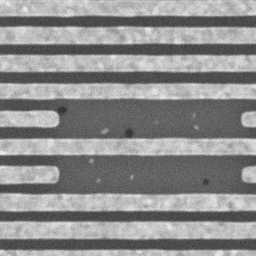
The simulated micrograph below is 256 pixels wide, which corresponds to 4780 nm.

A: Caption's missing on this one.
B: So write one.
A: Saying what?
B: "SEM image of wiring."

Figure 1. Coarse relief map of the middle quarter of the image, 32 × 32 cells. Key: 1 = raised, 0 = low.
11111111111111111111111111111111
11111111111111111111111111111111
00000000000000000000000000000000
00000000000000000000000000000000
00000000000000000000000000000000
11111111111111111111111111111111
11111111111111111111111111111111
11111111111111111111111111111111
00111111111110000001111111111111
00000000000000000000000000000000
00000000000000000000000000000000
00000000000000000000000000000000
00000000000000000000000000000000
00000000000000000000000000000000
00000000000000000000000000000000
00000000000000000000000000000000
00000000000000000000000000000000
00000000000000000000000000000000
00000000000000000000000000000000
11111111111111111111111111111111
11111111111111111111111111111111
11111111111111111111111111111111
00000000000000000011111110000000
00000000000000000000000000000000
00000000000000000000000000000000
00000000000000000000000000000000
00000000000000000000000000000000
00000000000000000000000000000000
00000000000000000000000000000000
00000000000000000000000000000000
00000000000000000000000000000000
00000000000000000000000000000000